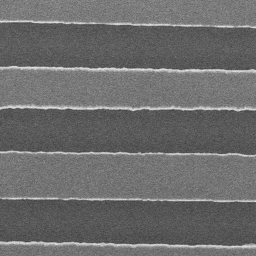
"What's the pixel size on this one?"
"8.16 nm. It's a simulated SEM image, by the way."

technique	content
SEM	lines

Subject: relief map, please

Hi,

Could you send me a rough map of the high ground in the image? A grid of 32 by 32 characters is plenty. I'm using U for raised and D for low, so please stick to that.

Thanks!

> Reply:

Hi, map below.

UUUUUUUUUUUUUUUUUUUUUUUUUUUUUUUU
UUUUUUUUUUUUUUUUUUUUUUUUUUUUUUUU
UUUUUUUUUUUUUUUUUUUUUUUUUUUUUUUU
DDDDDDDDDDDDDDDDDDDDDDDDDDDDDDDD
DDDDDDDDDDDDDDDDDDDDDDDDDDDDDDDD
DDDDDDDDDDDDDDDDDDDDDDDDDDDDDDDD
DDDDDDDDDDDDDDDDDDDDDDDDDDDDDDDD
DDDDDDDDDDDDDDDDDDDDDDDDDDDDDDDD
UUUUUUUDDDUDDDDDDDDDDDDDDDDDDDDD
UUUUUUUUUUUUUUUUUUUUUUUUUUUUUUUU
UUUUUUUUUUUUUUUUUUUUUUUUUUUUUUUU
UUUUUUUUUUUUUUUUUUUUUUUUUUUUUUUU
UUUUUUUUUUUUUUUUUUUUUUUUUUUUUUUU
UUUDUUUUUUUUUUUUUUUUUUUUUUUUUUUU
DDDDDDDDDDDDDDDDDDDDDDDDDDDDDDDD
DDDDDDDDDDDDDDDDDDDDDDDDDDDDDDDD
DDDDDDDDDDDDDDDDDDDDDDDDDDDDDDDD
DDDDDDDDDDDDDDDDDDDDDDDDDDDDDDDD
DDDDDDDDDDDDDDDDDDDDDDDDDDDDDDDD
UUUUUUUUUUUUUUUUUUUUUUUUUUUUUUUU
UUUUUUUUUUUUUUUUUUUUUUUUUUUUUUUU
UUUUUUUUUUUUUUUUUUUUUUUUUUUUUUUU
UUUUUUUUUUUUUUUUUUUUUUUUUUUUUUUU
UUUUUUUUUUUUUUUUUUUUUUUUUUUUUUUU
UUUUUUUUUUUUUUUUUUUUUUUUUUUUUUUU
DDDDDDDDDDDDDDDDDDDDDDDDDDDDDDDD
DDDDDDDDDDDDDDDDDDDDDDDDDDDDDDDD
DDDDDDDDDDDDDDDDDDDDDDDDDDDDDDDD
DDDDDDDDDDDDDDDDDDDDDDDDDDDDDDDD
DDDDDDDDDDDDDDDDDDDDDDDDDDDDDDDD
UUUUUUUUUUUUUUUDDDDDDDDDDDDDDDDD
UUUUUUUUUUUUUUUUUUUUUUUUUUUUUUUU